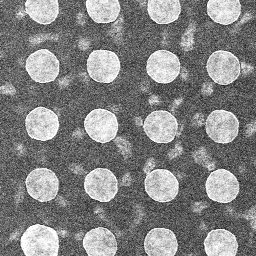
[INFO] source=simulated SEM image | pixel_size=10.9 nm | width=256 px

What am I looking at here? a regular array of raised bodies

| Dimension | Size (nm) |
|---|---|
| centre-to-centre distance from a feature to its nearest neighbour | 642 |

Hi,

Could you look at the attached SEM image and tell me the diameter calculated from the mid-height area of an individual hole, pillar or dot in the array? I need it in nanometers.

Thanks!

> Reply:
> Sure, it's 361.